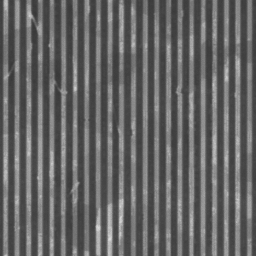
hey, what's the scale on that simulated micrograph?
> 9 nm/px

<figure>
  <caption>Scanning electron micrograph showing parallel lines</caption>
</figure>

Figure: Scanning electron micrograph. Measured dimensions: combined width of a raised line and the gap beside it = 0.104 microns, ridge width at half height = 41.6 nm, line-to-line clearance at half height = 58.5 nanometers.